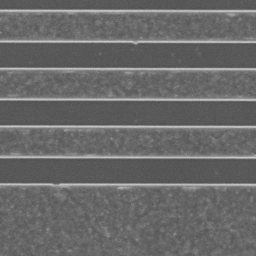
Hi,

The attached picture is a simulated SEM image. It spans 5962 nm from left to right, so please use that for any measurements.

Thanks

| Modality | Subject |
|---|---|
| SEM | parallel lines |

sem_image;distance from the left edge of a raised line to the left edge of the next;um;1.35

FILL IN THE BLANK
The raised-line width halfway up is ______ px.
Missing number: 30.9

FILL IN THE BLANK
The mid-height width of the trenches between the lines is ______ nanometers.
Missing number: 640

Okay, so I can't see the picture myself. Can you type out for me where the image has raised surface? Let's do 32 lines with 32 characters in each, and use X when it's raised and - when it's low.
--------------------------------
XXXXXXXXXXXXXXXXXXXXXXXXXXXXXXXX
XXXXXXXXXXXXXXXXXXXXXXXXXXXXXXXX
XXXXXXXXXXXXXXXXXXXXXXXXXXXXXXXX
XXXXXXXXXXXXXXXXXXXXXXXXXXXXXXXX
--------------------------------
--------------------------------
--------------------------------
--------------------------------
XXXXXXXXXXXXXXXXXXXXXXXXXXXXXXXX
XXXXXXXXXXXXXXXXXXXXXXXXXXXXXXXX
XXXXXXXXXXXXXXXXXXXXXXXXXXXXXXXX
--------------------------------
--------------------------------
--------------------------------
--------------------------------
XXXXXXXXXXXXXXXXXXXXXXXXXXXXXXXX
XXXXXXXXXXXXXXXXXXXXXXXXXXXXXXXX
XXXXXXXXXXXXXXXXXXXXXXXXXXXXXXXX
XXXXXXXXXXXXXXXXXXXXXXXXXXXXXXXX
--------------------------------
--------------------------------
--------------------------------
XXXXXXXXXXXXXXXXXXXXXXXXXXXXXXXX
XXXXXXXXXXXXXXXXXXXXXXXXXXXXXXXX
XXXXXXXXXXXXXXXXXXXXXXXXXXXXXXXX
XXXXXXXXXXXXXXXXXXXXXXXXXXXXXXXX
XXXXXXXXXXXXXXXXXXXXXXXXXXXXXXXX
XXXXXXXXXXXXXXXXXXXXXXXXXXXXXXXX
XXXXXXXXXXXXXXXXXXXXXXXXXXXXXXXX
XXXXXXXXXXXXXXXXXXXXXXXXXXXXXXXX
XXXXXXXXXXXXXXXXXXXXXXXXXXXXXXXX